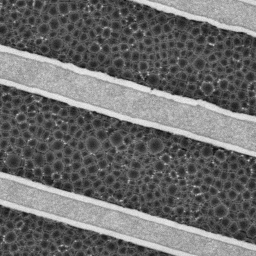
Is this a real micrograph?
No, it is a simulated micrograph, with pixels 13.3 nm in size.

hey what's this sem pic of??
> one or a few lines or trenches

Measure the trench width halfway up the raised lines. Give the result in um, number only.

1.2